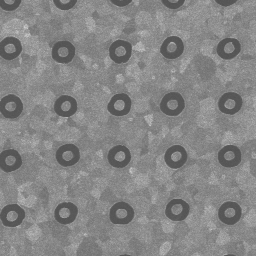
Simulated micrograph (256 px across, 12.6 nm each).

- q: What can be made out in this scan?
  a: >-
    a regular array of ring-shaped grooves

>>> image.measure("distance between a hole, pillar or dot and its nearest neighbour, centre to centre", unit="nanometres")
666